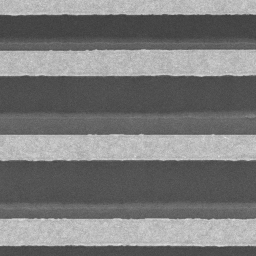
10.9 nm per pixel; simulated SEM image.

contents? lines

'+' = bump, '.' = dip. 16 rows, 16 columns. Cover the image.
++++++++++++++++
................
................
++++++++++++++++
++++++++++++++++
................
................
++++++++++++++++
++++++++++++++++
++++++++++++++++
................
................
................
++++++++++++++++
++++++++++++++++
................